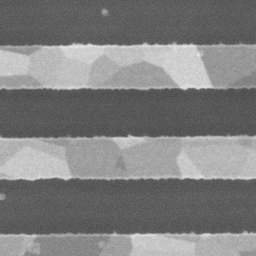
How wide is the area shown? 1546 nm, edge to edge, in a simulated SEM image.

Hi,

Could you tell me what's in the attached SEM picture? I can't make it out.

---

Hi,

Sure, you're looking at lines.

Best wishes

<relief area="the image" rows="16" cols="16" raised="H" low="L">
LLLLLLLLLLLLLLLL
LLLLLLLLLLLLLLLL
LLLLLLLLLLLLLLLL
HHHHHHHHHHHHHHHH
HHHHHHHHHHHHHHHH
HHHHHHHHHHHHHHHL
LLLLLLLLLLLLLLLL
LLLLLLLLLLLLLLLL
LLLLLLLLLLLLLLLL
HHHHHHHHHHHHHHHH
HHHHHHHHHHHHHHHH
LLLLLLLLLLLLLLLL
LLLLLLLLLLLLLLLL
LLLLLLLLLLLLLLLL
LLLLLLLLLLLLLLLL
HHHHHHHHHHHHHHHH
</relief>